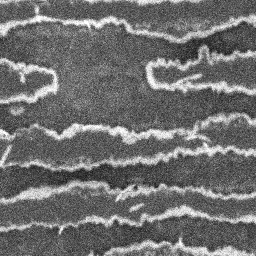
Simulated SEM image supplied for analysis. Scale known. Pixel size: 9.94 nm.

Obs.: one or a few lines or trenches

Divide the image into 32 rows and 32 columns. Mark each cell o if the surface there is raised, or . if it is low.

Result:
oooooooooooooooooooooooooooooooo
oooooooooooooooooooooooooooooooo
oooo...ooooooooooooooooooooooo..
o...............oooooooooooo....
.....................ooo........
................................
.........................o...o..
o........................ooooooo
ooooo..............ooooooooooooo
ooooooo............ooooooooooooo
ooooooo............ooooooooooooo
oooooo.........................o
o...............................
................................
.............................oo.
.........................ooooooo
..oooo..ooooooo...o..ooooooooooo
oooooooooooooooooooooooooooooooo
oooooooooooooooooooooooooooooooo
ooooooooooooooooooooo...........
ooooooooooooo.o.................
................................
................................
.......oooooo......ooo.oo.......
...oooooooooooooooooooooooo....o
oooooooooooooooooooooooooooooooo
ooooooooooooooooooooooo.oooooooo
oooooooooooooo.ooo.........oooo.
ooo....o........................
................................
..................o.o.o.........
.............ooooooooooooo......